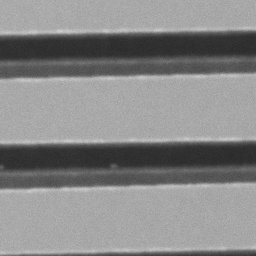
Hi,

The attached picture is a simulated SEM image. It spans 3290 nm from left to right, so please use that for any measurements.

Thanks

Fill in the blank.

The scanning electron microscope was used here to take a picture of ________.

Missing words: lines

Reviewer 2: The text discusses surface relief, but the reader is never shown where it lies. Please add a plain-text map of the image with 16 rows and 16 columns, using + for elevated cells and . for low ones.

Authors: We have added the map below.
++++++++++++++++
++++++++++++++++
................
................
++++++++++++++++
++++++++++++++++
++++++++++++++++
++++++++++++++++
++++++++++++++++
................
................
++++++++++++++++
++++++++++++++++
++++++++++++++++
++++++++++++++++
++++++++++++++++